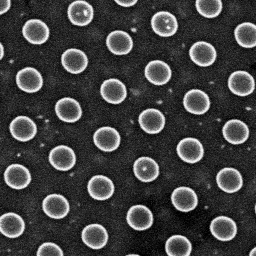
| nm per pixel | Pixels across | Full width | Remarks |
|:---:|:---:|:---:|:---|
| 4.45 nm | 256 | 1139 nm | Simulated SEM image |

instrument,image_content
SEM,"a regular array of raised bodies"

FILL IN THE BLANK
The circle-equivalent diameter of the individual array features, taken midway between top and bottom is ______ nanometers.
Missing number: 108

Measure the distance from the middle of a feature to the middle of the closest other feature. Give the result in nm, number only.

215